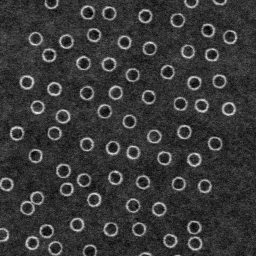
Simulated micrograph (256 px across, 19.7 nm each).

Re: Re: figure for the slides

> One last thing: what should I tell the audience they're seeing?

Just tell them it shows a regular array of raised bodies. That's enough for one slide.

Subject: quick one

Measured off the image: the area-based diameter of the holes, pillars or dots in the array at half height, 0.247 microns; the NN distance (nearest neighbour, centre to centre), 478 nanometers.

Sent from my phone